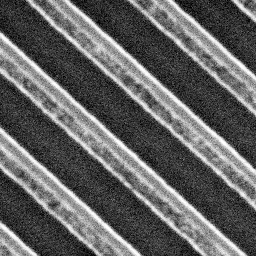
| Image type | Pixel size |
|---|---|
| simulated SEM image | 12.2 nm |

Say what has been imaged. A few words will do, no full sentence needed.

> lines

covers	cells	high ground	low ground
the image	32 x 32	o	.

....ooooo........ooooo........oo
.....ooooo........ooooo........o
......ooooo........ooooo........
.......ooooo........ooooo.......
........ooooo........ooooo......
o........ooooo........ooooo.....
ooo........oooo........ooooo....
oooo........ooooo........oooo...
ooooo........ooooo........ooooo.
.ooooo........ooooo........ooooo
..ooooo........ooooo........oooo
...ooooo........ooooo........ooo
....ooooo........ooooo........oo
.....ooooo........ooooo........o
......ooooo........ooooo........
.......ooooo........ooooo.......
.........ooooo........ooooo.....
o.........ooooo........ooooo....
ooo........ooooo........ooooo...
oooo........ooooo........ooooo..
ooooo........ooooo........ooooo.
.ooooo........ooooo........ooooo
..ooooo........ooooo........oooo
...ooooo........ooooo........ooo
....ooooo........ooooo........oo
.....ooooo........ooooo........o
......ooooo.........ooooo.......
........ooooo........ooooo......
o........ooooo........ooooo.....
oo........ooooo........ooooo....
ooo........ooooo........ooooo...
oooo........ooooo........ooooo..